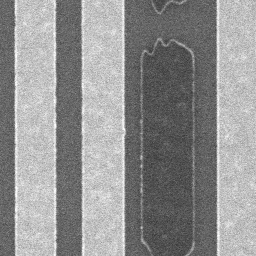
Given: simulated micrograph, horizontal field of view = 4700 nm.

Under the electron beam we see one or a few lines or trenches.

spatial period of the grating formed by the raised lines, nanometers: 1220